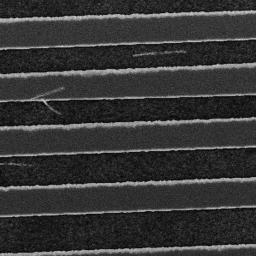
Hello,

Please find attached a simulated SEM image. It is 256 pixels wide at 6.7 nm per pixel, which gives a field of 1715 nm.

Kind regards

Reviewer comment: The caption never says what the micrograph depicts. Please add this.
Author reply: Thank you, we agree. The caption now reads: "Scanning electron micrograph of lines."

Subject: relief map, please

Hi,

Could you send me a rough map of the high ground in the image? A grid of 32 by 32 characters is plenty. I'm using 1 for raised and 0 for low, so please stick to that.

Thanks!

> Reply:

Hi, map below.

00000000000000000000000000000000
00000000000000000000000000000011
11111111111111111111111111111111
11111111111111111111111111111111
11111111111111111111111111111111
11111111111111111000000000000000
00000000000000000000000000000000
00000000000000000000000000000000
00000000000000000001111111111111
11111111111111111111111111111111
11111111111111111111111111111111
11111111111111111111111111111111
11111100000000000000000000000000
00000000000000000000000000000000
00000000000000000000000000000000
00000000000111111111111111111111
11111111111111111111111111111111
11111111111111111111111111111111
11111111111111111111111111100000
10000000000000000000000000000000
00000000000000000000000000000000
00000000000000000000000000000000
00000000000000000000000000011111
11111111111111111111111111111111
11111111111111111111111111111111
11111111111111111111111111111111
11111111111111111000000000000000
00000000000000000000000000000000
00000000000000000000000000000000
00000000000000000000000000000000
00000000000000000000000000000000
00000000111111111111111111111111